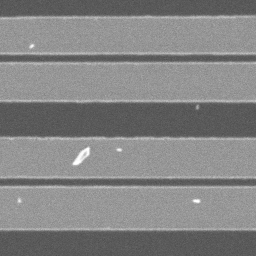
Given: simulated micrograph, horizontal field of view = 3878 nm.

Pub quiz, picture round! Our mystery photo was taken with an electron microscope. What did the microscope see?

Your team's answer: lines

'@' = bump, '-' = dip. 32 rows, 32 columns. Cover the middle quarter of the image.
--------------------------------
--------------------------------
--------------------------------
--------------------------------
--------------------------------
--------------------------------
--------------------------------
--------------------------------
--------------------------------
@@@@@@@@@@@@@@@@@@@@@@@@@@@@@@@@
@@@@@@@@@@@@@@@@@@@@@@@@@@@@@@@@
@@@@@@@@@@@@@@@@@@@@@@@@@@@@@@@@
@@@@@@@@@@@@@@@@@@@@@@@@@@@@@@@@
@@@@@@@@@@@@@@@@@@@@@@@@@@@@@@@@
@@@@@@@@@@@@@@@@@@@@@@@@@@@@@@@@
@@@@@@@@@@@@@@@@@@@@@@@@@@@@@@@@
@@@@@@@@@@@@@@@@@@@@@@@@@@@@@@@@
@@@@@@@@@@@@@@@@@@@@@@@@@@@@@@@@
@@@@@@@-@-@@@-@@@@@@@-@@@@@@@@@@
--------------------------------
--------------------------------
-----@--------------------------
----@@--------------------------
---@@---------------------------
---@----------------------------
--------------------------------
--------------------------------
--------------------------------
@@@@@@@@@@@@@@@@@@@@@@@@@@@@@@@@
@@@@@@@@@@@@@@@@@@@@@@@@@@@@@@@@
@@@@@@@@@@@@@@@@@@@@@@@@@@@@@@@@
--------------------------------